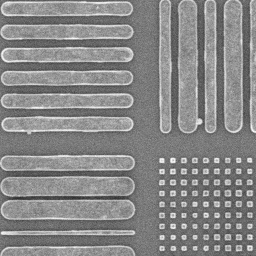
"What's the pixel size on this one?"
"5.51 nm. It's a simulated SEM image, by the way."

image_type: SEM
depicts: groups of lines, slits or small figures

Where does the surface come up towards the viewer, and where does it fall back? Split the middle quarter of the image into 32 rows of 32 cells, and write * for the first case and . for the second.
........................***..***
........................***..***
*****************.......***..***
*****************.......***..***
*****************.......***..***
........................**...***
........................**...***
........................**...***
*****************.......**...***
*****************.......***..***
*****************.......***..***
........................***..***
........................***..***
....********............***..***
*****************.......***..***
*****************.......***..***
...********.............***..***
................................
................................
................................
................................
................................
................................
*****************...............
******************..............
*****************...............
........................*..*.*..
................................
********....****................
*****************.......*..*.*..
******************..............
*****************...............